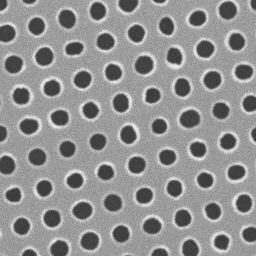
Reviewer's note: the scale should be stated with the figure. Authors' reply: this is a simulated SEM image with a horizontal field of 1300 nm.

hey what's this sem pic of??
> a regular array of holes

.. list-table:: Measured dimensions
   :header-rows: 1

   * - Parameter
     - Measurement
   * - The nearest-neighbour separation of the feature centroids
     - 159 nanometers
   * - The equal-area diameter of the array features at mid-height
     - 84.3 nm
